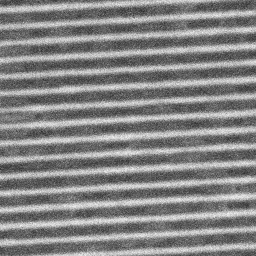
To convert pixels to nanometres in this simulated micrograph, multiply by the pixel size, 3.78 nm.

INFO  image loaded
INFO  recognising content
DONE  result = parallel lines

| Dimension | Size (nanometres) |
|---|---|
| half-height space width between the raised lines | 46.2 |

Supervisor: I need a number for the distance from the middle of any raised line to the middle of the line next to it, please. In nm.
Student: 62.8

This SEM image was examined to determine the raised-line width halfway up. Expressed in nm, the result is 17.9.